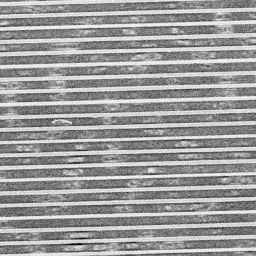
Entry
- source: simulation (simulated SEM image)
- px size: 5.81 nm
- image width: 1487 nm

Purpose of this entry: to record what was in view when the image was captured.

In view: parallel lines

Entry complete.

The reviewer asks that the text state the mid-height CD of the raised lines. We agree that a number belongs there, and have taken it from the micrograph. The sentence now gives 20.3 nanometers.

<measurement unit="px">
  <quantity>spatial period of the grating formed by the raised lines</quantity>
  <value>12.6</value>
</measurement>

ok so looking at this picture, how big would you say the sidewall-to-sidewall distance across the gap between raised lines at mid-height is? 0.0559 micrometres